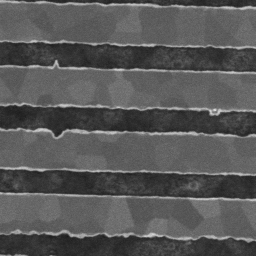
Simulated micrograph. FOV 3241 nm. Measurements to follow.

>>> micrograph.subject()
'one or a few lines or trenches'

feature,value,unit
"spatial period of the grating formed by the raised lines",807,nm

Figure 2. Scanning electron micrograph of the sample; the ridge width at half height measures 508 nm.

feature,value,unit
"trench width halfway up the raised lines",302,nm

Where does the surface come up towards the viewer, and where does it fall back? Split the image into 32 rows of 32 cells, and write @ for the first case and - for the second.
@@@@@@@-@@@@---@----------------
@@@@@@@@@@@@@@@@@@@@@@@@@@@@@@@@
@@@@@@@@@@@@@@@@@@@@@@@@@@@@@@@@
@@@@@@@@@@@@@@@@@@@@@@@@@@@@@@@@
@@@@@@@@@@@@@@@@@@@@@@@@@@@@@@@@
-----------@@-@@@@@@@@@@@@@@@@@@
--------------------------------
--------------------------------
@@@@@@@@@-@---------------------
@@@@@@@@@@@@@@@@@@@@@@@@@@@@@@@@
@@@@@@@@@@@@@@@@@@@@@@@@@@@@@@@@
@@@@@@@@@@@@@@@@@@@@@@@@@@@@@@@@
@@@@@@@@@@@@@@@@@@@@@@@@@@@@@@@@
--------------@@@@@@@@@@@@@@@@@@
--------------------------------
--------------------------------
@@@@@@--@@@-@@@@----------------
@@@@@@@@@@@@@@@@@@@@@@@@@@@@@@@@
@@@@@@@@@@@@@@@@@@@@@@@@@@@@@@@@
@@@@@@@@@@@@@@@@@@@@@@@@@@@@@@@@
@@@@@@@@@@@@@@@@@@@@@@@@@@@@@@@@
---------------@@--@@@@@@@@@@@@@
--------------------------------
--------------------------------
@@@@@@@@@@@@@@@-----------------
@@@@@@@@@@@@@@@@@@@@@@@@@@@@@@@@
@@@@@@@@@@@@@@@@@@@@@@@@@@@@@@@@
@@@@@@@@@@@@@@@@@@@@@@@@@@@@@@@@
@@@@@@@@@@@@@@@@@@@@@@@@@@@@@@@@
----------@@-----@--@@@@@@@@@@@@
--------------------------------
--------------------------------